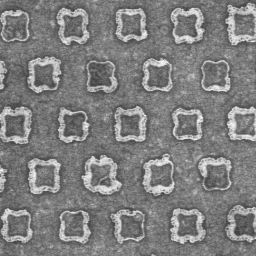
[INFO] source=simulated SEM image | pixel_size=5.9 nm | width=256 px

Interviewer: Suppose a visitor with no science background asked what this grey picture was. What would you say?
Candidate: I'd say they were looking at a regular array of raised bodies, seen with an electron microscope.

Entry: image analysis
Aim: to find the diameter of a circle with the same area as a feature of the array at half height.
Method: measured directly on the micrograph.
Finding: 0.198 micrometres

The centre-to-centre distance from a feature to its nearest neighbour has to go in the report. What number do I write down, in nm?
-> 332